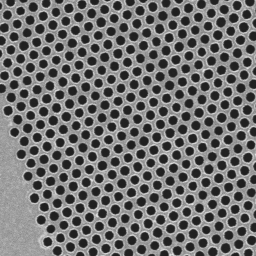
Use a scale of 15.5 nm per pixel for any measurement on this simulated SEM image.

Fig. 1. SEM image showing a regular array of holes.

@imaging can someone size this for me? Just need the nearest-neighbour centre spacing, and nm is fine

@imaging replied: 203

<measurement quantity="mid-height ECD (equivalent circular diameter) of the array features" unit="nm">147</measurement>